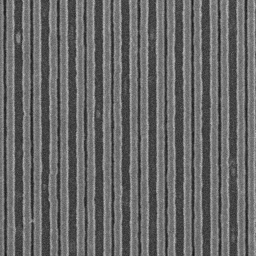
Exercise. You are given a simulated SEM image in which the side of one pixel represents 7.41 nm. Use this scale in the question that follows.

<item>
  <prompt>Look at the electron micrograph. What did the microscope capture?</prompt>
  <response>parallel lines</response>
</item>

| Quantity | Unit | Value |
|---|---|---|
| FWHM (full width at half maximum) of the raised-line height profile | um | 0.0509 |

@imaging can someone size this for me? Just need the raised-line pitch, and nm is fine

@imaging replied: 99.3